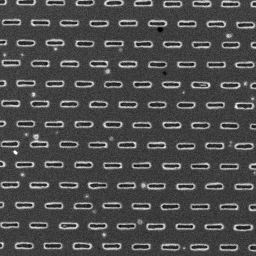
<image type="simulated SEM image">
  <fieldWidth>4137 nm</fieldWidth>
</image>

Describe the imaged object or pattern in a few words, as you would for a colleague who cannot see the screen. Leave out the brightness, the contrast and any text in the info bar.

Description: a regular array of holes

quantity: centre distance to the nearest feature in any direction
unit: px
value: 24.6